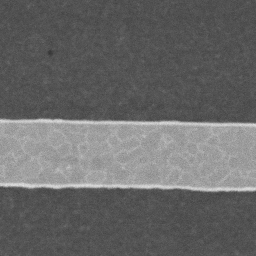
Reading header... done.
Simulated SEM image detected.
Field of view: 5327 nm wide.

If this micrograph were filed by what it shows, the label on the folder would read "one or a few lines or trenches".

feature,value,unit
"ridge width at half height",1330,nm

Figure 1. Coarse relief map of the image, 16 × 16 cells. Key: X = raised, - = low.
----------------
----------------
----------------
----------------
----------------
----------------
----------------
----------------
XXXXXXXXXXXXXXXX
XXXXXXXXXXXXXXXX
XXXXXXXXXXXXXXXX
XXXXXXXXXXXXXXXX
----------------
----------------
----------------
----------------